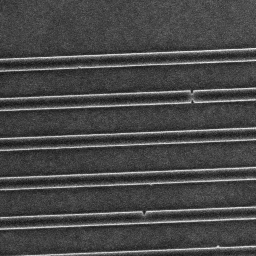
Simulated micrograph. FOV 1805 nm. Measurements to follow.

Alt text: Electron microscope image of parallel lines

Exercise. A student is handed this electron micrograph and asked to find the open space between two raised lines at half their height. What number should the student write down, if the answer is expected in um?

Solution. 0.195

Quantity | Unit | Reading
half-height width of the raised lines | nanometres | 88.1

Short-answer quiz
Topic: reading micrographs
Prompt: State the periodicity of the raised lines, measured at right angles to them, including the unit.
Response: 279 nm